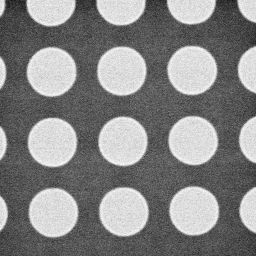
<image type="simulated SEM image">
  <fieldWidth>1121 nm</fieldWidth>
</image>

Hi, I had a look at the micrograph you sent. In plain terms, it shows an array of small figures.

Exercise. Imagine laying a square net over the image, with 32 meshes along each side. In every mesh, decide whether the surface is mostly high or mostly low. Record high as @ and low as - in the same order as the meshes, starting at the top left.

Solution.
---@@@@@@---@@@@@@---@@@@@@---@@
----@@@@@---@@@@@@---@@@@@@---@@
----@@@@-----@@@@-----@@@@-----@
--------------------------------
--------------------------------
--------------------------------
-----@@@-----@@@@-----@@@@-----@
----@@@@@----@@@@@---@@@@@@---@@
@---@@@@@---@@@@@@---@@@@@@---@@
@---@@@@@---@@@@@@---@@@@@@---@@
----@@@@@----@@@@@----@@@@----@@
-----@@@------@@@------@@-------
--------------------------------
--------------------------------
--------------------------------
-----@@@-----@@@@-----@@@@-----@
----@@@@@----@@@@@---@@@@@@---@@
@---@@@@@---@@@@@@---@@@@@@---@@
@---@@@@@---@@@@@@---@@@@@@---@@
----@@@@@----@@@@@----@@@@-----@
-----@@@------@@----------------
--------------------------------
--------------------------------
-----------------------@@-------
-----@@@@----@@@@@----@@@@@----@
@---@@@@@----@@@@@---@@@@@@---@@
@---@@@@@@---@@@@@---@@@@@@---@@
@---@@@@@----@@@@@---@@@@@@---@@
----@@@@@----@@@@@----@@@@-----@
------@-------------------------
--------------------------------
--------------------------------